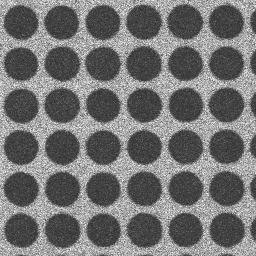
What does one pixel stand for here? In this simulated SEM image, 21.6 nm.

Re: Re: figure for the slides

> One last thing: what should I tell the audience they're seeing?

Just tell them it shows a regular array of holes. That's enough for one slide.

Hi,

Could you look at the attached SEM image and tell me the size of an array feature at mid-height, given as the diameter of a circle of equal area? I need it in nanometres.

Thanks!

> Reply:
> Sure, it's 753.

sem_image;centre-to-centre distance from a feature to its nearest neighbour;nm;885